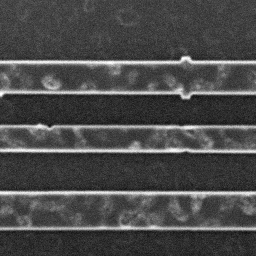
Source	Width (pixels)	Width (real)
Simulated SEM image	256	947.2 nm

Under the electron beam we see one or a few lines or trenches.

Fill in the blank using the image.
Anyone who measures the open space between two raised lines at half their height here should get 136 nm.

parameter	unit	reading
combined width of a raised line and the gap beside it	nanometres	247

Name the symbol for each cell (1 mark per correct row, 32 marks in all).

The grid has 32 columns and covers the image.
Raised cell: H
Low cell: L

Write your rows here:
LLLLLLLLLLLLLLLLLLLLLLLLLLLLLLLL
LLLLLLLLLLLLLLLLLLLLLLLLLLLLLLLL
LLLLLLLLLLLLLLLLLLLLLLLLLLLLLLLL
LLLLLLLLLLLLLLLLLLLLLLLLLLLLLLLL
LLLLLLLLLLLLLLLLLLLLLLLLLLLLLLLL
LLLLLLLLLLLLLLLLLLLLLLLLLLLLLLLL
LLLLLLLLLLLLLLLLLLLLLLLLLLLLLLLL
LLLLLLLLLLLLLLLLLLLLLLLHLLLLLLLL
HHHHHHHHHHHHHHHHHHHHHHHHHHHHHHHH
HHHHHHHHHHHHHHHHHHHHHHHHHHHHHHHH
HHHHHHHHHHHHHHHHHHHHHHHHHHHHHHHH
HHHHHHHHHHHHHHHHHHHHHHHHHHHHHHHH
LLLLLLLLLLLLLLLLLLLLLLLLLLLLLLLL
LLLLLLLLLLLLLLLLLLLLLLLLLLLLLLLL
LLLLLLLLLLLLLLLLLLLLLLLLLLLLLLLL
LLLLLLLLLLLLLLLLLLLLLLLLLLLLLLLL
HHHHHHHHHHHHHHHHHHHHHHHHHHHHHHHH
HHHHHHHHHHHHHHHHHHHHHHHHHHHHHHHH
HHHHHHHHHHHHHHHHHHHHHHHHHHHHHHHH
LLLLLLLLLLLLLLLLLLLLLLLLLLLLLLLL
LLLLLLLLLLLLLLLLLLLLLLLLLLLLLLLL
LLLLLLLLLLLLLLLLLLLLLLLLLLLLLLLL
LLLLLLLLLLLLLLLLLLLLLLLLLLLLLLLL
LLLLLLLLLLLLLLLLLLLLLLLLLLLLLLLL
HHHHHHHHHHHHHHHHHHHHHHHHHHHHHHHH
HHHHHHHHHHHHHHHHHHHHHHHHHHHHHHHH
HHHHHHHHHHHHHHHHHHHHHHHHHHHHHHHH
HHHHHHHHHHHHHHHHHHHHHHHHHHHHHHHH
HHHHHHHHHHHHHHHHHHHHHHHHHHHHHHHH
LLLLLLLLLLLLLLLLLLLLLLLLLLLLLLLL
LLLLLLLLLLLLLLLLLLLLLLLLLLLLLLLL
LLLLLLLLLLLLLLLLLLLLLLLLLLLLLLLL